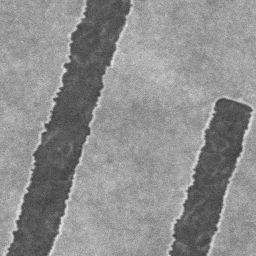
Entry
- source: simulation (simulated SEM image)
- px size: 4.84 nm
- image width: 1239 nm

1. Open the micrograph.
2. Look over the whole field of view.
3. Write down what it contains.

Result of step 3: one or a few lines or trenches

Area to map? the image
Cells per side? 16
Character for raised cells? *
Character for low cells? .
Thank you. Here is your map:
*****...********
*****...********
****...*********
****...*********
****...*********
****..**********
***...*******..*
***...*******...
***...*******..*
**...*******...*
**...*******...*
**...*******..**
*...********..**
*...*******...**
*...*******...**
*..********..***